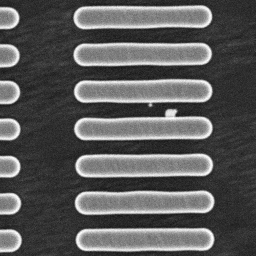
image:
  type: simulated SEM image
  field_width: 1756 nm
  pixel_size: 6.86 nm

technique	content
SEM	groups of lines, slits or small figures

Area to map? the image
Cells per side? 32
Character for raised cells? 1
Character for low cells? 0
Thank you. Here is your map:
00000000000000000000000000000000
11000000001111111111111111000000
11000000011111111111111111000000
00000000001000000000000000000000
00000000000000000000000000000000
00000000000000111000000000000000
11000000011111111111111111000000
11000000011111111111111111000000
00000000000000000000000000000000
00000000000000000000000000000000
11000000001111111111111111000000
11000000011111111111111111000000
11000000001111111111111111000000
00000000000000000000000000000000
00000000000000000000010000000000
11000000001111111111111111000000
11000000011111111111111111000000
00000000000000000000000000000000
00000000000000000000000000000000
00000000001111111111111111000000
11000000001111111111111111100000
11000000001111111111111111000000
00000000000000000000000000000000
00000000000000000000000000000000
11000000001111111111111111000000
11000000011111111111111111100000
11000000001111111111111111000000
00000000000000000000000000000000
00000000000000000000000000000000
11000000001111111111111111100000
11100000001111111111111111100000
00000000000000000000000000000000